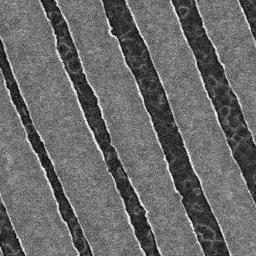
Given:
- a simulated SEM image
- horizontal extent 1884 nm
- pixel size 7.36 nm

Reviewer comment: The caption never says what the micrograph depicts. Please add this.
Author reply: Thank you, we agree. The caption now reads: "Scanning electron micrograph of one or a few lines or trenches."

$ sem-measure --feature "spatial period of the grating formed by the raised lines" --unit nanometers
464